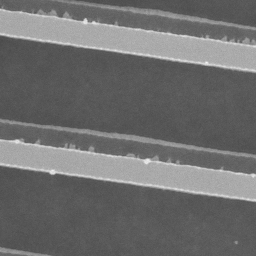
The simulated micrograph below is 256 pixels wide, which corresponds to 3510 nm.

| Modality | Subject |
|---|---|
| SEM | lines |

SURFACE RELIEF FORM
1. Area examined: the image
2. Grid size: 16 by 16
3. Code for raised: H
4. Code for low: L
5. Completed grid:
HHHHHHHLLLLLLLLL
HHHHHHHHHHHHHHLL
LLHHHHHHHHHHHHHH
LLLLLLLLLHHHHHHH
LLLLLLLLLLLLLLLL
LLLLLLLLLLLLLLLL
LLLLLLLLLLLLLLLL
LLLLLLLLLLLLLLLL
HHHHHHLLLLLLLLLL
HHHHHHHHHHHHHLLL
LHHHHHHHHHHHHHHH
LLLLLLLLHHHHHHHH
LLLLLLLLLLLLLLLH
LLLLLLLLLLLLLLLL
LLLLLLLLLLLLLLLL
LLLLLLLLLLLLLLLL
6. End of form